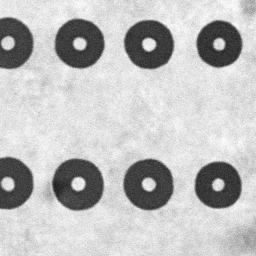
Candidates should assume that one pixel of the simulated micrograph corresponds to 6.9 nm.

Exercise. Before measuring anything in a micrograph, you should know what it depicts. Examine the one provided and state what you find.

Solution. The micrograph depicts ring-shaped grooves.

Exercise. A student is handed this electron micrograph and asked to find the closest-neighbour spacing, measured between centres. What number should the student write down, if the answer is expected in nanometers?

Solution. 481